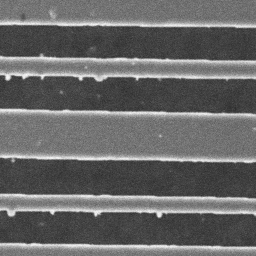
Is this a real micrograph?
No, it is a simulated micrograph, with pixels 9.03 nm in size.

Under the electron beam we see lines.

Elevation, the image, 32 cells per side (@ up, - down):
@@@@@@@@@@@@@@@@@@@@@@@@@@@@@@@@
@@@@@@@@@@@@@@@@@@@@@@@@@@@@@@@@
@@@@@@@@@@@@@@@@@@@@@@@@@@@@@@@@
--------------------------------
--------------------------------
--------------------------------
--------------------------------
@@@@@@@@@@@@@@@@@@@@@-----------
@@@@@@@@@@@@@@@@@@@@@@@@@@@@@@@@
@@@--@---@@@@@@@@@@@@@@@@@@@@@@@
--------------------------------
--------------------------------
--------------------------------
--------------------------------
@@@@@@@@@@@@@@@@@@@@@@@@@@@@@@@@
@@@@@@@@@@@@@@@@@@@@@@@@@@@@@@@@
@@@@@@@@@@@@@@@@@@@@@@@@@@@@@@@@
@@@@@@@@@@@@@@@@@@@@@@@@@@@@@@@@
@@@@@@@@@@@@@@@@@@@@@@@@@@@@@@@@
@@@@@@@@@@@@@@@@@@@@@@@@@@@@@@@@
--------------------------------
--------------------------------
--------------------------------
--------------------------------
@@@@@@@@@@@@@@------------------
@@@@@@@@@@@@@@@@@@@@@@@@@@@@@@@@
-@----@----@@----@@@@@@@@@@@@@@@
--------------------------------
--------------------------------
--------------------------------
@@@@@---------------------------
@@@@@@@@@@@@@@@@@@@@@@@@@@@@@@@@